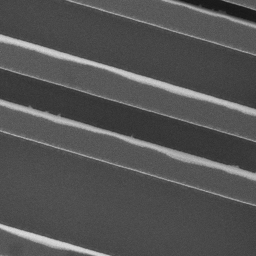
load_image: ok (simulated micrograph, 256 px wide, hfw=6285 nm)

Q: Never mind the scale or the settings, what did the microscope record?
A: lines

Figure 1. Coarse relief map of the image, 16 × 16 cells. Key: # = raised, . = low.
......#######...
.........#######
#............###
####............
.#######........
....#######.....
#.......#######.
####.......#####
.#######.......#
....#######.....
........######..
...........#####
...............#
................
#...............
#####...........